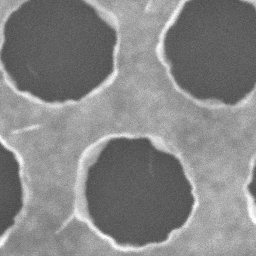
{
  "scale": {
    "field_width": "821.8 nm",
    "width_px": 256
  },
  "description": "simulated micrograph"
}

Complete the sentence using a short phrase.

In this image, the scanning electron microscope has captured holes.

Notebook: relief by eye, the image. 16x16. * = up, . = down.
*.....*****.....
.......****.....
.......***......
.......***......
.......****.....
*.....*****.....
*************..*
****************
****************
.*****....******
.****......*****
.****.......****
.****.......****
.*****......****
******.....*****
****************